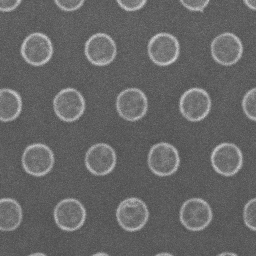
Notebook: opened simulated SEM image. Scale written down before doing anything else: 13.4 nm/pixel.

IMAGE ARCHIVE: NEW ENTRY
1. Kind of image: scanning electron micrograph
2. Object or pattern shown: a regular array of raised bodies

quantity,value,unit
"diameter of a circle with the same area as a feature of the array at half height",405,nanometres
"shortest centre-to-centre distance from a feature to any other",0.845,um